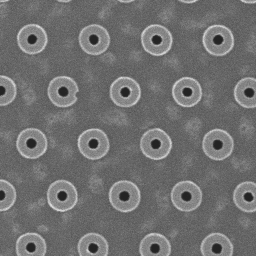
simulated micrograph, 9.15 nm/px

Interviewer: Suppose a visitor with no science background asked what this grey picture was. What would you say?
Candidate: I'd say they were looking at a regular array of ring-shaped raised bodies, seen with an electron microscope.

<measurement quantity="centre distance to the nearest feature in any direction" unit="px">60.4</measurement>